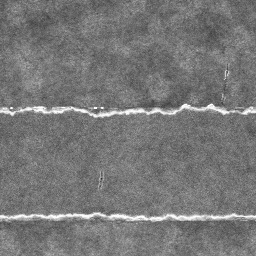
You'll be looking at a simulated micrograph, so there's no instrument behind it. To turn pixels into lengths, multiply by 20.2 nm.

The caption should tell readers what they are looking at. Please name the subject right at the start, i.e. one or a few lines or trenches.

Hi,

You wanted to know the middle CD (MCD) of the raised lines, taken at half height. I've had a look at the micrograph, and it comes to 2.13 micrometres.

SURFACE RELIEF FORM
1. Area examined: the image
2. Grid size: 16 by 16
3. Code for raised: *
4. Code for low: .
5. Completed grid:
................
................
................
................
................
................
................
****************
****************
****************
****************
****************
****************
**.*...*********
................
................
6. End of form